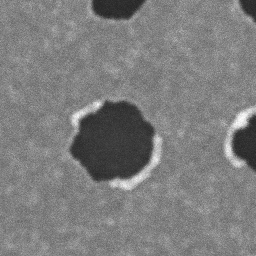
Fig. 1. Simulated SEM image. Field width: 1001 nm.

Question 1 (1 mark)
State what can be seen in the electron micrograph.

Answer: holes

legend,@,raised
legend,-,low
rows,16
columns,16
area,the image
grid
@@@@@@---@@@@@@-
@@@@@@@@@@@@@@@@
@@@@@@@@@@@@@@@@
@@@@@@@@@@@@@@@@
@@@@@@@@@@@@@@@@
@@@@@@@@@@@@@@@@
@@@@@@--@@@@@@@@
@@@@@----@@@@@@@
@@@@@-----@@@@@-
@@@@------@@@@@-
@@@@@----@@@@@@@
@@@@@@@@@@@@@@@@
@@@@@@@@@@@@@@@@
@@@@@@@@@@@@@@@@
@@@@@@@@@@@@@@@@
@@@@@@@@@@@@@@@@